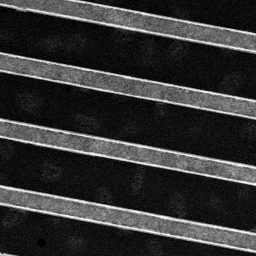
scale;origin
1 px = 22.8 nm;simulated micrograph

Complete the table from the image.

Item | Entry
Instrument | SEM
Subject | one or a few lines or trenches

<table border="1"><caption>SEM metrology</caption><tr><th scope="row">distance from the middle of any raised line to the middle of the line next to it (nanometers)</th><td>1490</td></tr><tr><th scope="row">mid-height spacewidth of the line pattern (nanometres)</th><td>1110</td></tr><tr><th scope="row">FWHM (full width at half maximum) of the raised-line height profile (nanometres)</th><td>383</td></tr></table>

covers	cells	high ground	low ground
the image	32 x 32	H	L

HHHHHHHHHHHLLLLLLLLLLLLLLLLLLLLL
LLLLLHHHHHHHHHHHHLLLLLLLLLLLLLLL
LLLLLLLLLLHHHHHHHHHHHHLLLLLLLLLL
LLLLLLLLLLLLLLLLHHHHHHHHHHHLLLLL
LLLLLLLLLLLLLLLLLLLLLHHHHHHHHHHH
LLLLLLLLLLLLLLLLLLLLLLLLLLHHHHHH
LLLLLLLLLLLLLLLLLLLLLLLLLLLLLLLL
HHHHLLLLLLLLLLLLLLLLLLLLLLLLLLLL
HHHHHHHHHLLLLLLLLLLLLLLLLLLLLLLL
LLLLHHHHHHHHHHHLLLLLLLLLLLLLLLLL
LLLLLLLLLHHHHHHHHHHHLLLLLLLLLLLL
LLLLLLLLLLLLLLHHHHHHHHHHHLLLLLLL
LLLLLLLLLLLLLLLLLLLLHHHHHHHHHHHL
LLLLLLLLLLLLLLLLLLLLLLLLLHHHHHHH
LLLLLLLLLLLLLLLLLLLLLLLLLLLLLLLH
HHHLLLLLLLLLLLLLLLLLLLLLLLLLLLLL
HHHHHHHHLLLLLLLLLLLLLLLLLLLLLLLL
LLHHHHHHHHHHHLLLLLLLLLLLLLLLLLLL
LLLLLLLHHHHHHHHHHHHLLLLLLLLLLLLL
LLLLLLLLLLLLLHHHHHHHHHHHLLLLLLLL
LLLLLLLLLLLLLLLLLLHHHHHHHHHHHLLL
LLLLLLLLLLLLLLLLLLLLLLLLHHHHHHHH
LLLLLLLLLLLLLLLLLLLLLLLLLLLLLHHH
HLLLLLLLLLLLLLLLLLLLLLLLLLLLLLLL
HHHHHHLLLLLLLLLLLLLLLLLLLLLLLLLL
HHHHHHHHHHHHLLLLLLLLLLLLLLLLLLLL
LLLLLLHHHHHHHHHHHLLLLLLLLLLLLLLL
LLLLLLLLLLLHHHHHHHHHHHLLLLLLLLLL
LLLLLLLLLLLLLLLLHHHHHHHHHHHHLLLL
LLLLLLLLLLLLLLLLLLLLLLHHHHHHHHHH
LLLLLLLLLLLLLLLLLLLLLLLLLLLHHHHH
LLLLLLLLLLLLLLLLLLLLLLLLLLLLLLLL